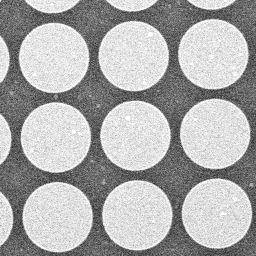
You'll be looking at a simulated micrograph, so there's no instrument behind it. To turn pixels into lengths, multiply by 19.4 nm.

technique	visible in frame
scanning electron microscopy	an array of small figures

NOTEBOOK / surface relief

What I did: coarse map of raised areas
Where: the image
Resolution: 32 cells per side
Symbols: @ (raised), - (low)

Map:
----@@@@@-----@@@@@-----@@@@@---
------@@------------------------
--------------------------@-----
-----@@@@-----@@@@@-----@@@@@---
---@@@@@@@---@@@@@@@---@@@@@@@--
@--@@@@@@@@--@@@@@@@@--@@@@@@@@-
@-@@@@@@@@@-@@@@@@@@@-@@@@@@@@@-
@-@@@@@@@@@-@@@@@@@@@-@@@@@@@@@-
@--@@@@@@@@--@@@@@@@@--@@@@@@@@-
@--@@@@@@@---@@@@@@@---@@@@@@@--
----@@@@@@----@@@@@-----@@@@@---
------@@------------------------
--------------------------@@----
-----@@@@-----@@@@@@----@@@@@@--
----@@@@@@---@@@@@@@---@@@@@@@@-
@--@@@@@@@@--@@@@@@@@--@@@@@@@@-
@--@@@@@@@@--@@@@@@@@--@@@@@@@@-
@--@@@@@@@@--@@@@@@@@--@@@@@@@@-
@--@@@@@@@@--@@@@@@@@--@@@@@@@@-
@--@@@@@@@@--@@@@@@@----@@@@@@--
----@@@@@@----@@@@@------@@@@---
--------------------------------
--------------------------@@----
-----@@@@@-----@@@@@----@@@@@@--
----@@@@@@@---@@@@@@@--@@@@@@@@-
@--@@@@@@@@--@@@@@@@@--@@@@@@@@-
@--@@@@@@@@--@@@@@@@@--@@@@@@@@-
@@-@@@@@@@@--@@@@@@@@--@@@@@@@@-
@--@@@@@@@@--@@@@@@@@--@@@@@@@@-
@---@@@@@@@---@@@@@@@---@@@@@@--
----@@@@@@-----@@@@@-----@@@@---
--------------------------------